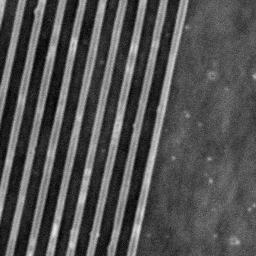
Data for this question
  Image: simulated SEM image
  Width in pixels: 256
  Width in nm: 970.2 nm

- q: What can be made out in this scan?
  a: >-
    parallel lines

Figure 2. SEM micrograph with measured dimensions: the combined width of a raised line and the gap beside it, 0.0753 µm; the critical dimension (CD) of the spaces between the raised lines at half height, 12.8 px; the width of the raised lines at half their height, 27.9 nanometers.